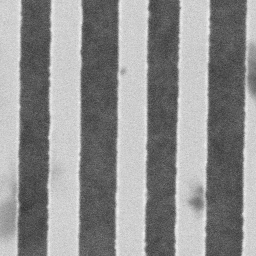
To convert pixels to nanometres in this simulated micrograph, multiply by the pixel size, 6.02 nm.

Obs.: lines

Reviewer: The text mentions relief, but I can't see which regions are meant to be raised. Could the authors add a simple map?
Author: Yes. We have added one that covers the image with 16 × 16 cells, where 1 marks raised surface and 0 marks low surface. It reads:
1001100110011001
1001100110011001
1001100110011001
1001100110011001
1001100110011001
1001100110011001
1001100110011001
1001100110011001
1001100110011001
1001100110011001
1001100110011001
1001100110011001
1001100110011001
1001100110011001
1001100110011001
1001100110011001